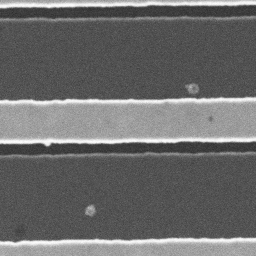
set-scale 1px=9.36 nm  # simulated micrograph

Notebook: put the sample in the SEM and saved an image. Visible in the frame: lines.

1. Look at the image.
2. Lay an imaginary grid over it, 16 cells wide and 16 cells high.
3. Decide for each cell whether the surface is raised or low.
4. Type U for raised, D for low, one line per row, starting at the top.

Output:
DDDDDDDDDDDDDDDD
DDDDDDDDDDDDDDDD
DDDDDDDDDDDDDDDD
DDDDDDDDDDDDDDDD
DDDDDDDDDDDDDDDD
DDDDDDDDDDDDDDDD
UUUUUUUUUUUUUUUU
UUUUUUUUUUUUUUUU
UUUUUUUUUUUUUUUU
DDDDDDDDDDDDDDDD
DDDDDDDDDDDDDDDD
DDDDDDDDDDDDDDDD
DDDDDDDDDDDDDDDD
DDDDDDDDDDDDDDDD
DDDDDDDDDDDDDDDD
UUUUUUUUUUUUUUUU